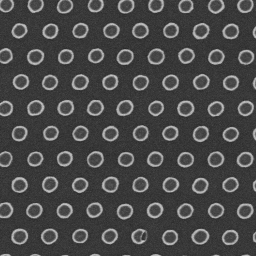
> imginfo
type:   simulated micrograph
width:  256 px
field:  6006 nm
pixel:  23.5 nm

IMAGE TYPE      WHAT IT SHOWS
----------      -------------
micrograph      a regular array of raised bodies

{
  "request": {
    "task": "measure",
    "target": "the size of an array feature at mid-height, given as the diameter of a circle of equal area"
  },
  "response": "338 nanometers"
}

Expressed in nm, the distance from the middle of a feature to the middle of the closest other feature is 687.